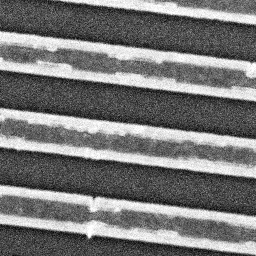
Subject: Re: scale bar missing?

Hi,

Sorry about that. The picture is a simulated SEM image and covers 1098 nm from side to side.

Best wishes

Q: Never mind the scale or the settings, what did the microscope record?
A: one or a few lines or trenches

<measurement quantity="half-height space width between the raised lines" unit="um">0.198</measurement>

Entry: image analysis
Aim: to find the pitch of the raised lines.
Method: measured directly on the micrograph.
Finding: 328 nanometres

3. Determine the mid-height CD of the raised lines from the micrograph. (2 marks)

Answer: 130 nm